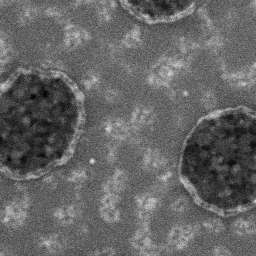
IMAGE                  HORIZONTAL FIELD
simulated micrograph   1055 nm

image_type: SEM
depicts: raised bodies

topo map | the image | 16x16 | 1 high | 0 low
0000000011110000
0000000000000000
0000000000000000
0000000000000000
0111000000000000
1111100000000000
1111100000000000
1111100000000111
1111100000001111
1111100000011111
1110000000011111
0000000000011111
0000000000001111
0000000000000000
0000000000000000
0000000000000000